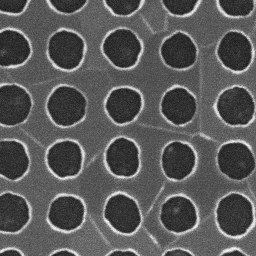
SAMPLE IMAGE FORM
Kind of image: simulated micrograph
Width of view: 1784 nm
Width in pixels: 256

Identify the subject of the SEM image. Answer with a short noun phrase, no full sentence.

a regular array of holes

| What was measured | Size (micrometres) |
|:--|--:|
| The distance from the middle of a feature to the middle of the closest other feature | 0.38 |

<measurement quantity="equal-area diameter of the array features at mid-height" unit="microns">0.26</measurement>